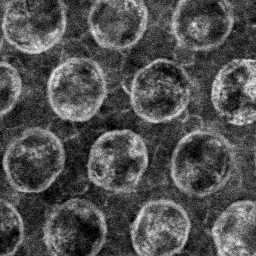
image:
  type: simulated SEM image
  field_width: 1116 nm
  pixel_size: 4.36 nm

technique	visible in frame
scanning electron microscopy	raised bodies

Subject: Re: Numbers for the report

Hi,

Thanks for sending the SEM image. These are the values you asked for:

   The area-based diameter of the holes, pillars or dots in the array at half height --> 254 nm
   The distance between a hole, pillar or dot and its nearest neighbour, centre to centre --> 359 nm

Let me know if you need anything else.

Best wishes